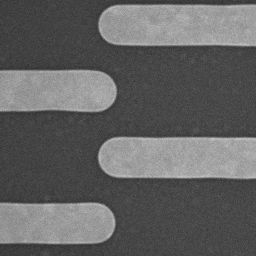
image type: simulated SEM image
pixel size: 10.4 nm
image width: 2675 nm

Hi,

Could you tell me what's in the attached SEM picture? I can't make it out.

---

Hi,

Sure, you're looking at groups of lines, slits or small figures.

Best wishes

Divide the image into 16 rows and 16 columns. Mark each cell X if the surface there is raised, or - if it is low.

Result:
-------XXXXXXXXX
------XXXXXXXXXX
-------XXXXXXXXX
----------------
XXXXXX----------
XXXXXXX---------
XXXXXXX---------
----------------
----------------
------XXXXXXXXXX
------XXXXXXXXXX
----------------
----------------
XXXXXXX---------
XXXXXXX---------
----------------